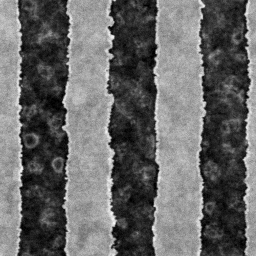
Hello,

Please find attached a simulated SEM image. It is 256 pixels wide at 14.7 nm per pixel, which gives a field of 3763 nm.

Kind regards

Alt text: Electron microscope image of one or a few lines or trenches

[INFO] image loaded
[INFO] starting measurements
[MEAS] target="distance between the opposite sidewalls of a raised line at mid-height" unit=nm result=650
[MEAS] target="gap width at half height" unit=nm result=680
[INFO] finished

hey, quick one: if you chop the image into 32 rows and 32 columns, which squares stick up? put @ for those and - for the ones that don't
@@------@@@@@@------@@@@@------@
@@------@@@@@@------@@@@@------@
@@-------@@@@@------@@@@@------@
@@@------@@@@@------@@@@@------@
@@@------@@@@@------@@@@@------@
@@@------@@@@@------@@@@@------@
@@-------@@@@@------@@@@@------@
@@@------@@@@@------@@@@@------@
@@@------@@@@------@@@@@@------@
@@-------@@@@------@@@@@@------@
@@------@@@@@------@@@@@@------@
@@------@@@@@-------@@@@@------@
@@------@@@@@@-----@@@@@@------@
@@@-----@@@@@@-----@@@@@@@-----@
@@------@@@@@@-----@@@@@@------@
@@@-----@@@@@-------@@@@@------@
@@------@@@@@@-----@@@@@@------@
@@-@@----@@@@@------@@@@@------@
@@@------@@@@@------@@@@@------@
@@-------@@@@@------@@@@@------@
@@@----@@@@@@@------@@@@@------@
@@@-----@@@@@@----@-@@@@@------@
@@@-----@@@@@@------@@@@@------@
@@------@@@@@@------@@@@@------@
@@@-----@@@@@@------@@@@@------@
@@@-----@@@@@@-----@@@@@@------@
@@@-----@@@@@@-----@@@@@@------@
@@@-----@@@@@@-----@@@@@@------@
@@------@@@@@@-----@@@@@@------@
@@------@@@@@@-----@@@@@@------@
@@------@@@@@@-----@@@@@@------@
@@------@@@@@@-----@@@@@@------@